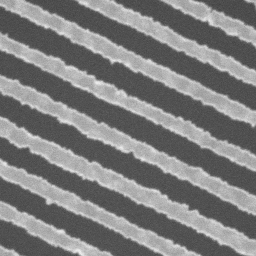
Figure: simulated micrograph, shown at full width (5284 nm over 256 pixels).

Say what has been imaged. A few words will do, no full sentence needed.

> parallel lines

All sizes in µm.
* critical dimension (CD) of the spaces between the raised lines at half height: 0.498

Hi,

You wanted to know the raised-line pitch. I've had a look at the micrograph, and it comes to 791 nm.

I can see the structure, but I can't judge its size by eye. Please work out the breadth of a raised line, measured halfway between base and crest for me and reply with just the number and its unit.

13.9 pixels